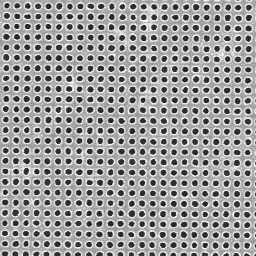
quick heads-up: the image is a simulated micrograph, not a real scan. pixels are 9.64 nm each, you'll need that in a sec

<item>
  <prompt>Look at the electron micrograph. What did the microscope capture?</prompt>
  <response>a regular array of holes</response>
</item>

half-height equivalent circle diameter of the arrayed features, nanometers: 58.6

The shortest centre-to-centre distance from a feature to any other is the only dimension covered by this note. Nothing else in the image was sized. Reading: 0.0973 um